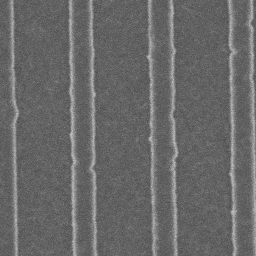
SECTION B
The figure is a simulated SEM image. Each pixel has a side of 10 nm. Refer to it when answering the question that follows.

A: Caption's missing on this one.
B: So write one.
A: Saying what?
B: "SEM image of one or a few lines or trenches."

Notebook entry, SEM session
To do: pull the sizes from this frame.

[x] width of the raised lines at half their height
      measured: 226 nm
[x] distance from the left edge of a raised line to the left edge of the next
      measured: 802 nm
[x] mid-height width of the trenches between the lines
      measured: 574 nm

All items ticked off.